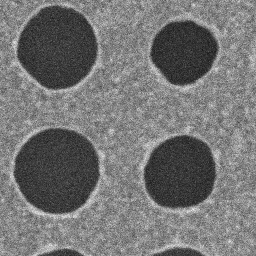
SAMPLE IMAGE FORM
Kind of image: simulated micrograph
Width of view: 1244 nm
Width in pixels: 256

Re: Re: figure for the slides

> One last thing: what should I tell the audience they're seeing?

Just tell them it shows holes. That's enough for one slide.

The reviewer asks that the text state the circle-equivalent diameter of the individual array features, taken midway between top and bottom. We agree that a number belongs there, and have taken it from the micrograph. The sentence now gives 382 nanometres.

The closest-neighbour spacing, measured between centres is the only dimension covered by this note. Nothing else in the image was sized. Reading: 122 px